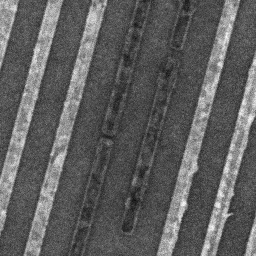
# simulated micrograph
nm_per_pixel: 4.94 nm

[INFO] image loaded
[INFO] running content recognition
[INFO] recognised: parallel lines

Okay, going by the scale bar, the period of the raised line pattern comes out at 0.211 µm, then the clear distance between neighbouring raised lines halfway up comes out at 29.6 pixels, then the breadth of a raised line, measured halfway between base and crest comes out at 63.2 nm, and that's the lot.